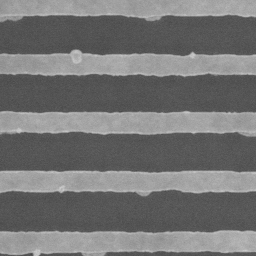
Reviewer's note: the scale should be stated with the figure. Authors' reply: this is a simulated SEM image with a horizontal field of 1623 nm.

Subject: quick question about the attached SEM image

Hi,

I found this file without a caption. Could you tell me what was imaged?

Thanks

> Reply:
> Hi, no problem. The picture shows lines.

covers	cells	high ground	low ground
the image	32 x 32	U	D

UUUUUUUUUUUUUUUUUUUUUUUUUUUUUUUU
UUUUUUUUUUUUUUUUUUUUUUUUUUUUUUUU
DDDDDDDDDDDDDDDDDDDDDDDDDDDDDDDD
DDDDDDDDDDDDDDDDDDDDDDDDDDDDDDDD
DDDDDDDDDDDDDDDDDDDDDDDDDDDDDDDD
DDDDDDDDDDDDDDDDDDDDDDDDDDDDDDDD
DDDDDDDDDUDDDDDDDDDDDDDDDDDDDDDD
UUUUUUUUUUUUUUUUUUUUUUUUUUUUUUUU
UUUUUUUUUUUUUUUUUUUUUUUUUUUUUUUU
DDDDDDDDDDDDDDDDDDDDUDDUDDDDDDDD
DDDDDDDDDDDDDDDDDDDDDDDDDDDDDDDD
DDDDDDDDDDDDDDDDDDDDDDDDDDDDDDDD
DDDDDDDDDDDDDDDDDDDDDDDDDDDDDDDD
DDDDDDDDDDDDDDDDDDDDDDDDDDDDDDDD
UUUUUUUUUUUUUUUUUUUUUUUUUUUUUUUU
UUUUUUUUUUUUUUUUUUUUUUUUUUUUUUUU
UDUUUUUUUDUUUUUUUUUUUUUUUUUUUUUU
DDDDDDDDDDDDDDDDDDDDDDDDDDDDDDDD
DDDDDDDDDDDDDDDDDDDDDDDDDDDDDDDD
DDDDDDDDDDDDDDDDDDDDDDDDDDDDDDDD
DDDDDDDDDDDDDDDDDDDDDDDDDDDDDDDD
UUUUUUUDUUUUUUUUUDDDDDUUUUUUUDDD
UUUUUUUUUUUUUUUUUUUUUUUUUUUUUUUU
UUUUUUUUUUUUUUUUUUUUUUUUUUUUUUUU
DDDDDDDDDDDDDDDDDDDDDDDDDDDDDDDD
DDDDDDDDDDDDDDDDDDDDDDDDDDDDDDDD
DDDDDDDDDDDDDDDDDDDDDDDDDDDDDDDD
DDDDDDDDDDDDDDDDDDDDDDDDDDDDDDDD
DDDDDDDDDDDDDDDDDDDDDDDDDDDDDDDD
UUUUUUUUUUUUUUUUUUUUUUUUUUUUUUUU
UUUUUUUUUUUUUUUUUUUUUUUUUUUUUUUU
UUUUUUUUUUUUUDDDDDDDDDDDDDDUUDDD